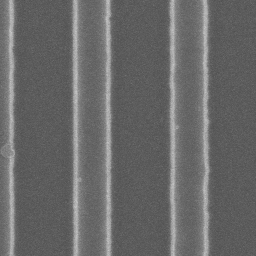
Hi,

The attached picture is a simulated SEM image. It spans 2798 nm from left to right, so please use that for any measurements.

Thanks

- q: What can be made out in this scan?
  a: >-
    one or a few lines or trenches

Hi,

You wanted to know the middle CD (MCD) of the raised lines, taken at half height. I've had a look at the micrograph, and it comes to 33.7 pixels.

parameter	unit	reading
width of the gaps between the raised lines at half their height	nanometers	692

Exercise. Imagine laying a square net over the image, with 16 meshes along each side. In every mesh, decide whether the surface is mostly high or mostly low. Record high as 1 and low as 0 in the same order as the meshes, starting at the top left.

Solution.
1000011000011000
1000011000011000
1000011000011000
1000011000011000
1000011000011000
1000011000011000
1000011000011000
1000011000011000
1000011000011000
1000011000011000
1000011000011000
1000011000011000
1000011000011000
1000011000011000
1000011000011000
1000011000011000